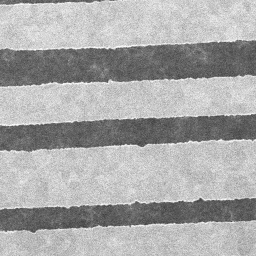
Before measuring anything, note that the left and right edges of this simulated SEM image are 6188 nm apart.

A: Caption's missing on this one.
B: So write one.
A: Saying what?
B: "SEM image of one or a few lines or trenches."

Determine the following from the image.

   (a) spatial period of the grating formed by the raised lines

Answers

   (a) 1810 nanometres